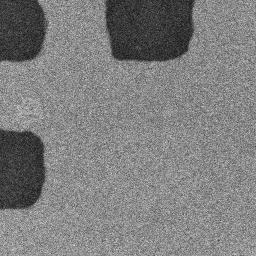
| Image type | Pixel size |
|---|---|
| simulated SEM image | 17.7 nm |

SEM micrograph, holes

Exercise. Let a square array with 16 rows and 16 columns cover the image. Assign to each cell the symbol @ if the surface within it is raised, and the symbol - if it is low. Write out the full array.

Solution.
---@@@@-----@@@@
---@@@@-----@@@@
---@@@@-----@@@@
--@@@@@----@@@@@
@@@@@@@@@@@@@@@@
@@@@@@@@@@@@@@@@
@@@@@@@@@@@@@@@@
@@@@@@@@@@@@@@@@
--@@@@@@@@@@@@@@
---@@@@@@@@@@@@@
---@@@@@@@@@@@@@
---@@@@@@@@@@@@@
--@@@@@@@@@@@@@@
@@@@@@@@@@@@@@@@
@@@@@@@@@@@@@@@@
@@@@@@@@@@@@@@@@